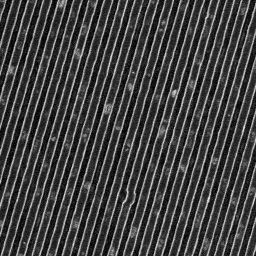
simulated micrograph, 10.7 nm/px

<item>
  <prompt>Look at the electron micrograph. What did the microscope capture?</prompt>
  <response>parallel lines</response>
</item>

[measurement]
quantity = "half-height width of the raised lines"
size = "0.0833 um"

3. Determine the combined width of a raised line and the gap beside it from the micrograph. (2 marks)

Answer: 156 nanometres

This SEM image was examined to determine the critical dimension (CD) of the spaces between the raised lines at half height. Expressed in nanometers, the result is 73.